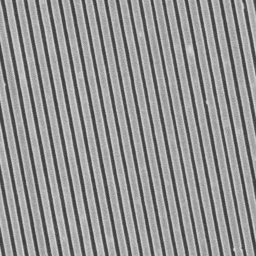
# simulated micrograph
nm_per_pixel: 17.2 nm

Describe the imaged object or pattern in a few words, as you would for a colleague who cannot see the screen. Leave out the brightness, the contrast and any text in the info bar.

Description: parallel lines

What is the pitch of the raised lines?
195 nm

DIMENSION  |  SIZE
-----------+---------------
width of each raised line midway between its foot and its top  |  129 nm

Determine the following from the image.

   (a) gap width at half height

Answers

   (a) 0.0656 µm